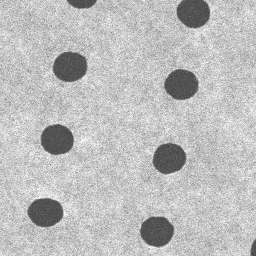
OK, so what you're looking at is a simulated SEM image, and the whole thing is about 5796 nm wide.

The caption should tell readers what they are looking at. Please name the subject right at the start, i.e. holes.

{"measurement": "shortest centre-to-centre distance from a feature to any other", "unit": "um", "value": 1.68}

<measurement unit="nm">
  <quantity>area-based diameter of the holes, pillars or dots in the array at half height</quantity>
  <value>736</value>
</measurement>